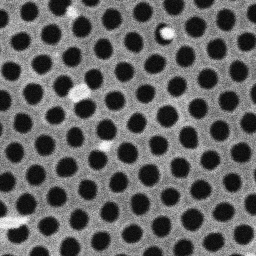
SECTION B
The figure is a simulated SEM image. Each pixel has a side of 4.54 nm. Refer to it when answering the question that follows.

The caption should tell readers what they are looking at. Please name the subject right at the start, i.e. a regular array of holes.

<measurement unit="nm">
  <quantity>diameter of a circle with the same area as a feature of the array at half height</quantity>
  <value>94.4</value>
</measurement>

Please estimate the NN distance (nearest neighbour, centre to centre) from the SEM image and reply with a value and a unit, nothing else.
138 nm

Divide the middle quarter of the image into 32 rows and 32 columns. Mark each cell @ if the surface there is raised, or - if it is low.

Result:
@--@@@@@@@@@@----@@@-----@@@@--@
@@@@@@---@@@@-----@@-----@@@@@@@
@@@@@-----@@@-----@@@@-@@@@@@@@@
--@@@-----@@@----@@@@@@@@@@---@@
--@@@-----@@@@-@@@@@@@@@@@-----@
--@@@@---@@@@@@@@@@---@@@@-----@
--@@@@@-@@@@@@@@@@-----@@@-----@
-@@@@@@@@@@----@@@-----@@@----@@
@@@@@@@@@@-----@@@----@@@@@@@@@@
@@@----@@@-----@@@@---@@@@@@@@@@
@@@-----@@-----@@@@@@@@@@--@@@@-
@@@-----@@@@--@@@@@@@@@-----@@@-
@@@----@@@@@@@@@@--@@@@------@@-
@@@@--@@@@@@@@@@----@@@------@@@
@@@@@@@@@---@@@@-----@@@----@@@@
@@@@@@@@-----@@@----@@@@---@@@--
@---@@@@-----@@@----@@@@@@@@@---
@----@@@-----@@@@@@@@@@@@@@@@---
@----@@@@----@@@@@@@@@---@@@@---
@----@@@@@@@@@@@@@@@@-----@@@---
@@--@@@@@@@@@@----@@@-----@@@@--
@@@@@@@@-@@@@-----@@@@----@@@@@@
@@@@@@-----@@------@@@---@@@@@@@
--@@@@-----@@@----@@@@@@@@@@--@@
---@@@-----@@@@---@@@@@@@@@----@
---@@@----@@@@@@@@@@---@@@@-----
---@@@@@-@@@@@@@@@@-----@@@----@
---@@@@@@@@@---@@@------@@@----@
@@@@@@@@@@@@----@@@-----@@@@--@@
@@@@----@@@-----@@@----@@@@@@@@@
@@@@----@@@-----@@@@--@@@@@@@@@@
@@@@----@@@@---@@@@@@@@@@---@@@-